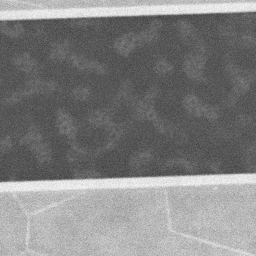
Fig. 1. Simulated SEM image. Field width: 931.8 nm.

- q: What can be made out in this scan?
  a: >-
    one or a few lines or trenches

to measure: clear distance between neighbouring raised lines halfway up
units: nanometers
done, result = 626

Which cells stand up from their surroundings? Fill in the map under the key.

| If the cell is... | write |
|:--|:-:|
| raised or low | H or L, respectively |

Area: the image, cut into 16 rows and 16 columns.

HHHHHHHHHHHHHLLL
LLLLLLLLLLLLLLLL
LLLLLLLLLLLLLLLL
LLLLLLLLLLLLLLLL
LLLLLLLLLLLLLLLL
LLLLLLLLLLLLLLLL
LLLLLLLLLLLLLLLL
LLLLLLLLLLLLLLLL
LLLLLLLLLLLLLLLL
LLLLLLLLLLLLLLLL
LLLLLLLLLLLLLLLL
LLLLLLLHHHHHHHHH
HHHHHHHHHHHHHHHH
HHHHHHHHHHHHHHHH
HHHHHHHHHHHHHHHH
HHHHHHHHHHHHHHHH